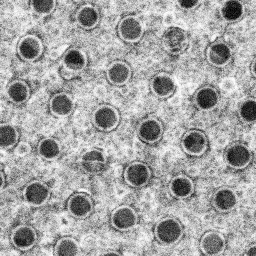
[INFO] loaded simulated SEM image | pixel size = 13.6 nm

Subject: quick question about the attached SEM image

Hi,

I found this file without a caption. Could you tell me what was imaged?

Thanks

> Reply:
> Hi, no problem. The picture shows a regular array of raised bodies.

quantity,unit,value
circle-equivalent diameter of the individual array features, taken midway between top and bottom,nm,328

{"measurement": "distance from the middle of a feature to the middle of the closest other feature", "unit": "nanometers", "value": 616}